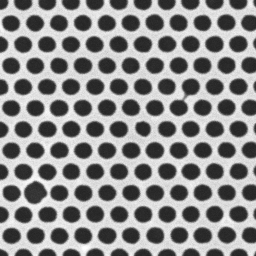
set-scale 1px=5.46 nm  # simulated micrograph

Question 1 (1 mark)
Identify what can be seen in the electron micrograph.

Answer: a regular array of holes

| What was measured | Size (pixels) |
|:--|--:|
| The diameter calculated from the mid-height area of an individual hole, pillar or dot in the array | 17.7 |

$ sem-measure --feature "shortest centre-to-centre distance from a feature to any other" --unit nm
130